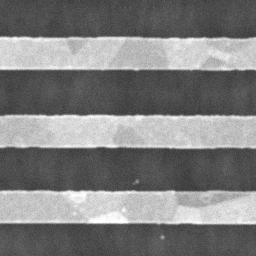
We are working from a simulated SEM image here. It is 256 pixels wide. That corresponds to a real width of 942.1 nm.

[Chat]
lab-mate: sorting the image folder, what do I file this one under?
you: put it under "lines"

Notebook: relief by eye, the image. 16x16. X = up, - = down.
----------------
----------------
XXXXXXXXXXXXXXXX
XXXXXXXXXXXXXXXX
----------------
----------------
----------------
XXXXXXXXXXXXXXXX
XXXXXXXXXXXXXXXX
----------------
----------------
----------------
XXXXXXXXXXXXXXXX
XXXXXXXXXXXXXXXX
----------------
----------------